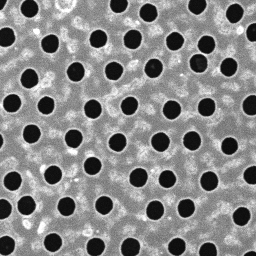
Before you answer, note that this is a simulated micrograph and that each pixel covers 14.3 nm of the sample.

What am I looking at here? a regular array of holes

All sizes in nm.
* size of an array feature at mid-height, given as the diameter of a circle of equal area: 266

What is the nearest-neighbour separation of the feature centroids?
476 nm